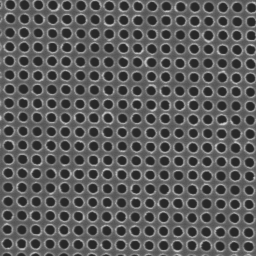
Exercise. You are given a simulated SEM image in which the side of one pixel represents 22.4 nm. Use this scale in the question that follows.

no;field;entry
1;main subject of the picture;a regular array of holes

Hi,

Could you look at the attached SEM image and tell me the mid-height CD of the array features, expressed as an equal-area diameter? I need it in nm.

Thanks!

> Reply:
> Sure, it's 201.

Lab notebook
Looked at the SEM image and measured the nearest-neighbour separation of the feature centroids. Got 311 nm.